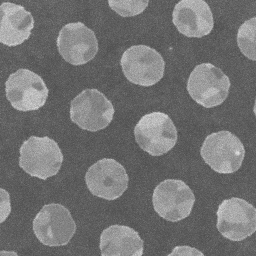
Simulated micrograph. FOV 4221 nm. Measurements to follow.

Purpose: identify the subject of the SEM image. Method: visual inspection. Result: a regular array of raised bodies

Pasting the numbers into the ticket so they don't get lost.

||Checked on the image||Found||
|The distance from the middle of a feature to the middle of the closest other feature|1130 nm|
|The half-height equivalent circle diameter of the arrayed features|685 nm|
